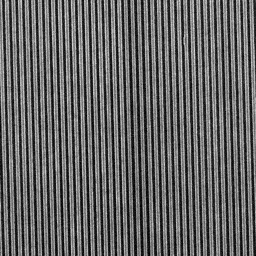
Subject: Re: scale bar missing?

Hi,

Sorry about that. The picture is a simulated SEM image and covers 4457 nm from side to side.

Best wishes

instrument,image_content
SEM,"parallel lines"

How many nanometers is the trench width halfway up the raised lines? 56.6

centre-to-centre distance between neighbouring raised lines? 115 nm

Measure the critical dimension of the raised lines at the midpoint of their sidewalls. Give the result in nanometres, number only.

56.6